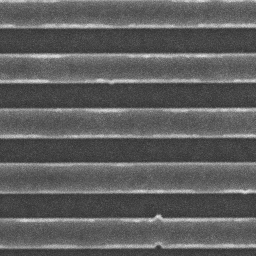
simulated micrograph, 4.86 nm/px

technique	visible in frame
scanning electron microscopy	parallel lines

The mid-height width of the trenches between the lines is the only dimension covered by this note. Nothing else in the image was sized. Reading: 124 nanometers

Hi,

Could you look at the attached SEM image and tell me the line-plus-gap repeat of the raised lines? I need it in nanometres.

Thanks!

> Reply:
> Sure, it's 267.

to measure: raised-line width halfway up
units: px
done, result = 29.6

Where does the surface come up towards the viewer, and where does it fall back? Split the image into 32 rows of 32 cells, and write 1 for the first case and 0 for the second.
11111111111111111111111111111111
11111111111111111111111111111111
11111111111111111111111111111111
00000000000000000000000000000000
00000000000000000000000000000000
00000000000000000000000000000000
00000000000000000000000000000000
11111111111111111111111111111111
11111111111111111111111111111111
11111111111111111111111111111111
00000000000000000000000000000000
00000000000000000000000000000000
00000000000000000000000000000000
00000000000000000000000000000000
11111111111111111111111111111111
11111111111111111111111111111111
11111111111111111111111111111111
00000000000000000000000000000000
00000000000000000000000000000000
00000000000000000000000000000000
11111101111111111111111111111111
11111111111111111111111111111111
11111111111111111111111111111111
11111111111111111111111111111111
00000000000000000000000000000000
00000000000000000000000000000000
00000000000000000000000000000000
11111111111111111111111111111111
11111111111111111111111111111111
11111111111111111111111111111111
11111111111111111111111111111111
00000000000000000000000000000000